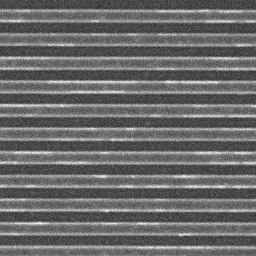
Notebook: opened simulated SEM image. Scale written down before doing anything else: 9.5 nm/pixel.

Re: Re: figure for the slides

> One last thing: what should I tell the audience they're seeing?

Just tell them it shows parallel lines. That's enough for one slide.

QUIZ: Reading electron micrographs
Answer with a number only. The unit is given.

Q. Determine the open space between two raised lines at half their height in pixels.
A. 12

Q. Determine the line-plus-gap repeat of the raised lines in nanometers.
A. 225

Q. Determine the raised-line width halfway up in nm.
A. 114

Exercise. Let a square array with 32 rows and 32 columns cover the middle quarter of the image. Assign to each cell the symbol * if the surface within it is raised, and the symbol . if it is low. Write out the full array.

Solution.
********************************
................................
................................
................................
*******...................*.....
********************************
********************************
................................
................................
................................
********************************
********************************
********************************
................................
................................
................................
********************************
********************************
********************************
................................
................................
................................
********************************
********************************
********************************
................................
................................
................................
********************************
********************************
********************************
................................